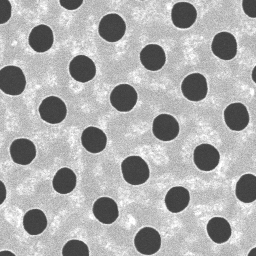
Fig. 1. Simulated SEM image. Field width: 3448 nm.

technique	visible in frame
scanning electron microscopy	a regular array of holes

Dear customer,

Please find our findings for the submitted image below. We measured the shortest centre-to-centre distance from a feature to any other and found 680 nm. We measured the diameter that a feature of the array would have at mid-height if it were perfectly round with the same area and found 362 nm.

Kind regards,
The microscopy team